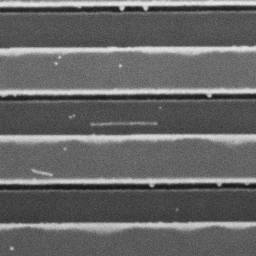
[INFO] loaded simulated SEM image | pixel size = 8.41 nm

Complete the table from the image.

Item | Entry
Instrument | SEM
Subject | lines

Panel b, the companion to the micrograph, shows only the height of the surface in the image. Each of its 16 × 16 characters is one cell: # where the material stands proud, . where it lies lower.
................
................
................
################
################
################
................
................
..##############
################
################
................
................
................
################
################